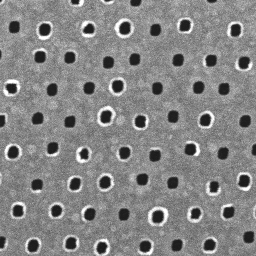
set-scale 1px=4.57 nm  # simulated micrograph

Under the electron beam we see a regular array of holes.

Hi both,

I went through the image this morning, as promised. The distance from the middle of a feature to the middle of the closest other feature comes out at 144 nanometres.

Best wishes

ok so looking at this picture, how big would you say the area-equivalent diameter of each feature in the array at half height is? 56.3 nanometers